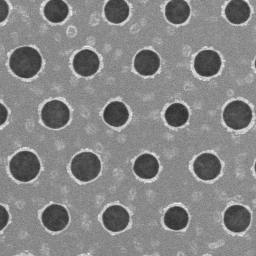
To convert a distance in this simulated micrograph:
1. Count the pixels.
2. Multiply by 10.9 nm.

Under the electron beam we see a regular array of holes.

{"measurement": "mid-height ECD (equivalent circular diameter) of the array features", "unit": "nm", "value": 310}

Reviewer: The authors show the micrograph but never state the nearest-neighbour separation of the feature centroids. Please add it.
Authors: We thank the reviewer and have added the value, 655 nanometres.